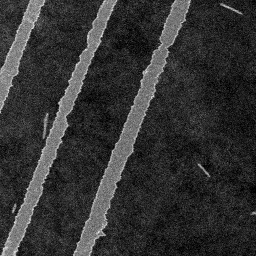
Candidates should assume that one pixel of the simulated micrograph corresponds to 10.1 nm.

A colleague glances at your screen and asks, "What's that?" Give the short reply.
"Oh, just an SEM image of one or a few lines or trenches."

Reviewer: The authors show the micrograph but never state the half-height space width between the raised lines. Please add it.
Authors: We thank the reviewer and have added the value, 545 nm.